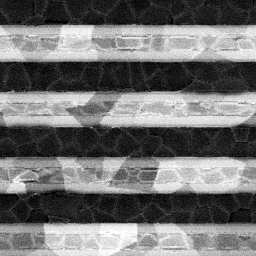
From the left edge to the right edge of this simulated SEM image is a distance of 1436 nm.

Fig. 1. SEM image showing one or a few lines or trenches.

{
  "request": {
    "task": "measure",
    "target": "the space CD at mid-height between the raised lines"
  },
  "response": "236 nanometres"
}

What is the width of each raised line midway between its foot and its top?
0.134 µm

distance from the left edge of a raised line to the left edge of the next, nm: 370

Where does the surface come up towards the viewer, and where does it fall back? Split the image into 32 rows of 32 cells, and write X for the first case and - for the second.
--------------------------------
--------------------------------
--------------------------------
--------------------------------
XXXXXXXXXXXXXXXXXXXXXXXXXXXXXXXX
XXXXXXXXXXXXXXXXXXXXXXXXXXXXXXXX
XXXXXXXXXXXXXXXXXXXXXXXXXXXXXXXX
--------------------------------
--------------------------------
--------------------------------
--------------------------------
--------------------------------
XXXXXXXXXXXXXXXXXXXXXXXXXXXXXXXX
XXXXXXXXXXXXXXXXXXXXXXXXXXXXXXXX
XXXXXXXXXXXXXXXXXXXXXXXXXXXXXXXX
--------------------------------
--------------------------------
--------------------------------
--------------------------------
--------------------------------
XXXXXXX---XXXXXXXXXXXX-XXXX-XXXX
XXXXXXXXXXXXXXXXXXXXXXXXXXXXXXXX
XXXXXXXXXXXXXXXXXXXXXXXXXXXXXXXX
--------------------------------
--------------------------------
--------------------------------
--------------------------------
--------------------------------
--------------------------------
XXXXXXXXXXXXXXXXXXXXXXXXXXXXXXXX
XXXXXXXXXXXXXXXXXXXXXXXXXXXXXXXX
XXXXXXXXXXXXXXXXXXXXXXXXXXXXXXXX